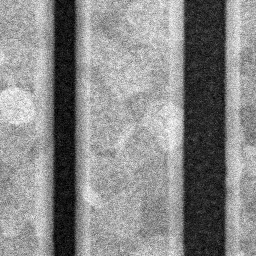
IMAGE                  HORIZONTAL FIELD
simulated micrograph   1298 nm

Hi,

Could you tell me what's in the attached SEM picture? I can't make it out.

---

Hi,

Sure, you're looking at one or a few lines or trenches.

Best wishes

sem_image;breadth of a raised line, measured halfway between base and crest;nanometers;480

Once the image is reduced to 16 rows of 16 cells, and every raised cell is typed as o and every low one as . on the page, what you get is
ooo..oooooo....o
ooo..oooooo....o
ooo..oooooo...oo
ooo..oooooo....o
ooo..oooooo....o
ooo..oooooo....o
ooo..oooooo....o
ooo..oooooo....o
ooo..oooooo....o
ooo..oooooo....o
ooo..oooooo....o
ooo..oooooo....o
ooo..oooooo....o
ooo..oooooo....o
ooo..oooooo....o
ooo..oooooo....o